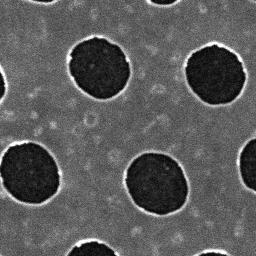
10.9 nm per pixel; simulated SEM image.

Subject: holes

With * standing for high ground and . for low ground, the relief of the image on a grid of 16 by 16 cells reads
****************
****************
*****..*********
****....****...*
****....****...*
*****...****...*
*************.**
****************
****************
...************.
....****...****.
....****....***.
*..*****....****
****************
****************
*****..*********